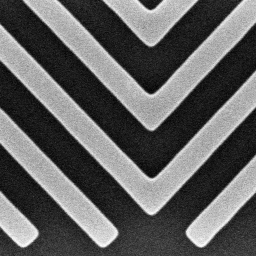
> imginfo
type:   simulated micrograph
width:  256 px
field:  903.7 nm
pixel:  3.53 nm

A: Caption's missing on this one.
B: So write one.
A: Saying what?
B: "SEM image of groups of lines, slits or small figures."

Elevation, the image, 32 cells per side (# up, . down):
...#####.....#####..####......##
....#####.....#########......###
.....#####.....#######......####
......####......#####......####.
#......####......###......####..
##......####......#......####...
###......####...........####....
####......####.........####.....
.####......####.......#####.....
..####......####......####.....#
...####......####....####......#
....####......####..####......##
.....####......########......###
......####......######......####
#......####......####......####.
##......####......##......####..
###......####............####...
####......####..........####....
.####......####........####.....
..####......####......####......
...####......####....####......#
...#####......####..####......##
....#####......########......###
.....#####.....#######......####
......#####.....#####......####.
#......#####.....####.....####..
##......#####.....#......####...
###......####...........#####...
####......####..........####....
.####......###..........###.....
..##........##..........##......
................................